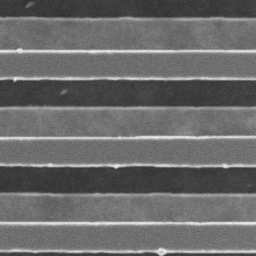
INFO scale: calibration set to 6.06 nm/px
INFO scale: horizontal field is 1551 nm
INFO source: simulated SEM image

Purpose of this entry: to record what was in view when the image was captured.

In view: lines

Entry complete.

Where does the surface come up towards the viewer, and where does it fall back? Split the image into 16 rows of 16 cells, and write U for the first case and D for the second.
DDDDDDDDDDDDDDDD
UUUUUUUUUUUUUUUU
UUUUUUUUUUUUUUUU
UUUUUUUUUUUUUUUU
UUUUUUUUUUUUUUUU
DDDDDDDDDDDDDDDD
DDDDDDDDDDDDDDDD
UUUUUUUUUUUUUUUU
UUUUUUUUUUUUUUUU
UUUUUUUUUUUUUUUU
DDDDDDDDDDDDDDDD
DDDDDDDDDDDDDDDD
UUUUUUUUUUUUUUUU
UUUUUUUUUUUUUUUU
UUUUUUUUUUUUUUUU
UUUUUUUUUUUUUUUU